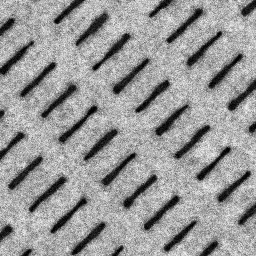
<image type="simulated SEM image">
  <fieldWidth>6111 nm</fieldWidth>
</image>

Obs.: a regular array of holes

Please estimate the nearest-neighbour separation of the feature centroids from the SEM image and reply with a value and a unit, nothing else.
723 nanometers